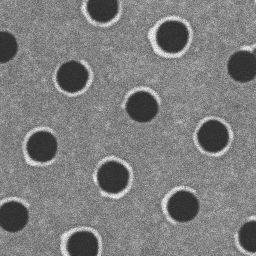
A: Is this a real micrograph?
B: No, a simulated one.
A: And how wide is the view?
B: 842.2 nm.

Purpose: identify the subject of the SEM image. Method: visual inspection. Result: holes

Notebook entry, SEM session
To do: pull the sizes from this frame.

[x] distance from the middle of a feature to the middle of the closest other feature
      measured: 250 nanometres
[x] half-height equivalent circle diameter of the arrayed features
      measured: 104 nm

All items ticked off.